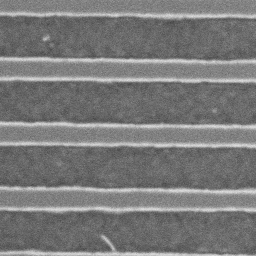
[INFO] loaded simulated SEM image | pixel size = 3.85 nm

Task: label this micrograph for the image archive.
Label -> lines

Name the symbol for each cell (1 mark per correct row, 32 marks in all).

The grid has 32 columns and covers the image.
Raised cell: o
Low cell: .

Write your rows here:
oooooooooooooooooooooooooooooooo
oooooooooooooooooooooooooooooooo
................................
................................
................................
................................
................................
ooooooooooooooooooooooo.........
oooooooooooooooooooooooooooooooo
oooooooooooooooooooooooooooooooo
................................
................................
................................
................................
................................
ooooooooo.......................
oooooooooooooooooooooooooooooooo
oooooooooooooooooooooooooooooooo
................................
................................
................................
................................
................................
oooooo.ooo......................
oooooooooooooooooooooooooooooooo
oooooooooooooooooooooooooooooooo
................................
................................
................................
................................
................................
................................